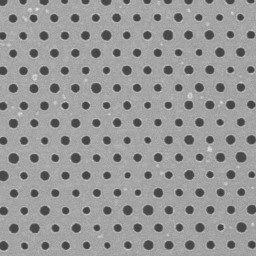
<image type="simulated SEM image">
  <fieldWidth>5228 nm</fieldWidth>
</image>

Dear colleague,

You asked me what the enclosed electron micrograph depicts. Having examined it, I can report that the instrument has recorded a regular array of holes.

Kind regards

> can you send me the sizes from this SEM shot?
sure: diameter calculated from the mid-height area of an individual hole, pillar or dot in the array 174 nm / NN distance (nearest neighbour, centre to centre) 410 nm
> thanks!